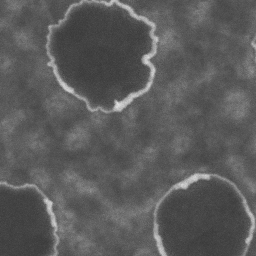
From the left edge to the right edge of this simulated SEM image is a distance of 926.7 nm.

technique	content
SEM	raised bodies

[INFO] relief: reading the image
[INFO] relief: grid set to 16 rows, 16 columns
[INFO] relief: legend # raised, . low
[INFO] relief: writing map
....####........
...######.......
...#######......
...#######......
...#######......
....#####.......
.....###........
................
................
................
................
...........####.
###.......#####.
###.......######
####......######
####......#####.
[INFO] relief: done